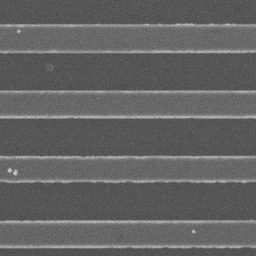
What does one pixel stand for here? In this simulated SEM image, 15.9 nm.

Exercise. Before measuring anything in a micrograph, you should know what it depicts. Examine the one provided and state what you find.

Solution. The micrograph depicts lines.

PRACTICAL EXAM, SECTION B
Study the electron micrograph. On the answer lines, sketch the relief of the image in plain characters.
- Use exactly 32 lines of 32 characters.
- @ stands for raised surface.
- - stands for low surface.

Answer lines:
--------------------------------
--------------------------------
--------------------------------
@@@@@@@@@@@@@@@@@@@@@@@@@@@@@@@@
@@@@@@@@@@@@@@@@@@@@@@@@@@@@@@@@
@@@@@@@@@@@@@@@@@@@@@@@@@@@@@@@@
@@@@@@@@@@@@@@@@@@@@@@@@@@@@@@@@
--------------------------------
--------------------------------
--------------------------------
--------------------------------
@@@@@@@@@@@@@@@@@@@@@@@@@@@@@@@@
@@@@@@@@@@@@@@@@@@@@@@@@@@@@@@@@
@@@@@@@@@@@@@@@@@@@@@@@@@@@@@@@@
@@@@@@@@@@@@@@@@@@@@@@@@@@@@@@@@
--------------------------------
--------------------------------
--------------------------------
--------------------------------
--------------------------------
@@@@@@@@@@@@@@@@@@@@@@@@@@@@@@@@
@@@@@@@@@@@@@@@@@@@@@@@@@@@@@@@@
@@@@@@@@@@@@@@@@@@@@@@@@@@@@@@@@
--------------------------------
--------------------------------
--------------------------------
--------------------------------
--------------------------------
@@@@@@@@@@@@@@@@@@@@@@@@@@@@@@@@
@@@@@@@@@@@@@@@@@@@@@@@@@@@@@@@@
@@@@@@@@@@@@@@@@@@@@@@@@@@@@@@@@
--------------------------------